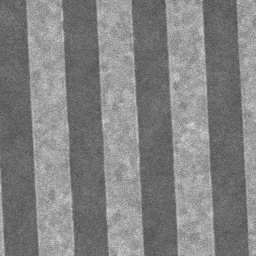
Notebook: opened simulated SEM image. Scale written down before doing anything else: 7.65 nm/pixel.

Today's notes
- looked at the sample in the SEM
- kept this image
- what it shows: one or a few lines or trenches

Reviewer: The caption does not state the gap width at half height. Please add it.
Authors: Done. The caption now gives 272 nm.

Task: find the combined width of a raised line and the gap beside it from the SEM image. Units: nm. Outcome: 535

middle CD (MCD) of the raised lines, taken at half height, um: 0.265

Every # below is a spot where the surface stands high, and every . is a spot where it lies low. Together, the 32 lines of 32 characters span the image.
...#####....####.....####.....##
...#####....####.....####.....##
...#####....####.....####.....##
....####....####.....####.....##
....####....#####....####.....##
....####....#####....####.....##
....####....#####....#####....##
....####.....####....#####....##
....####.....####....#####....##
....####.....####....#####....##
....####.....####....#####....##
....####.....####....#####....##
....####.....####....#####....##
....####.....####.....####....##
....####.....####.....####....##
....####.....####.....####....##
....####.....####.....####....##
....####.....####.....####....##
....#####....####.....####.....#
....#####....####.....####.....#
....#####....####.....####.....#
....#####....####.....####.....#
....#####....####.....####.....#
.....####....####.....####.....#
.....####....#####....####.....#
.....####....#####....####.....#
.....####....#####....####.....#
.....####.....####....####.....#
.....####.....####....#####....#
.....####.....####....#####....#
.....####.....####....#####....#
.....####.....####....#####....#